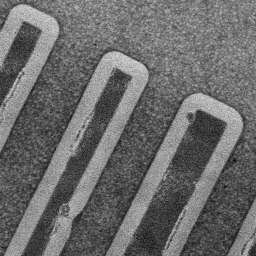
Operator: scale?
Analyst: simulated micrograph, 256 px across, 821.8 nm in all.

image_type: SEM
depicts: one or a few lines or trenches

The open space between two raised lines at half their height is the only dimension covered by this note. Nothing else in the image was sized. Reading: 175 nanometers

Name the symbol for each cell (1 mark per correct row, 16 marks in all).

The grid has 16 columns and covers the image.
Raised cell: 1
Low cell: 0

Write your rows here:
0000000000000000
0110000000000000
1110000000000000
1110000000000000
1100001110000000
1100001110000000
1000011100001000
1000011100011110
0000111000011110
0000111000111100
0001110000111100
0001110001111000
0011100001110000
0011000011110000
0111000011110001
0111000111100001